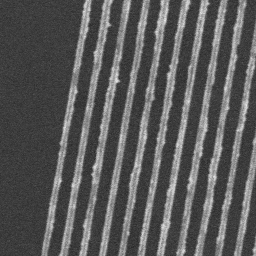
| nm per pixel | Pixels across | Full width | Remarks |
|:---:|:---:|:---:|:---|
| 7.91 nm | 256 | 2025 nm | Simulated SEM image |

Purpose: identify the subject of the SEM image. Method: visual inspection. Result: parallel lines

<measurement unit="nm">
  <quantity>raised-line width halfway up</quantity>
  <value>44.8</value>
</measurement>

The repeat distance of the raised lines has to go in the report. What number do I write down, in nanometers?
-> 150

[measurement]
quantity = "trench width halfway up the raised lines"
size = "0.104 micrometres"